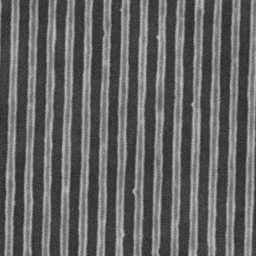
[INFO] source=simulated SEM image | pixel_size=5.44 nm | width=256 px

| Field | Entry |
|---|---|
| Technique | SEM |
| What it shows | parallel lines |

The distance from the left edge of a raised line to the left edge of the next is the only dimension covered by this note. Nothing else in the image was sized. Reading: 100 nm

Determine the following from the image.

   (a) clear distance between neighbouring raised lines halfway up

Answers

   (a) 63.9 nm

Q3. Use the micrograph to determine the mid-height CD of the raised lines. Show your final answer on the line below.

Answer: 36.7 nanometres